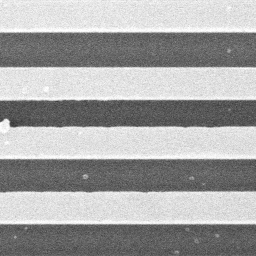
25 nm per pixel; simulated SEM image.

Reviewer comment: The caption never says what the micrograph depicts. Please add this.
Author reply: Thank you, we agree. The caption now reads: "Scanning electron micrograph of lines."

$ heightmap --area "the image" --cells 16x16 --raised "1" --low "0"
1111111111111111
1111111111111111
0000000000000000
0000000000000000
1111111111111111
1111111111111111
0000000000000000
0000000000000000
1111111111111111
1111111111111111
0000000000000000
0000000000000000
1111111111111111
1111111111111111
0000000000000000
0000000000000000